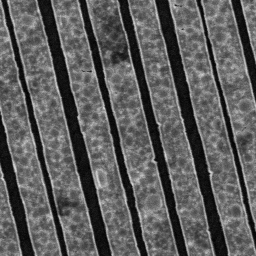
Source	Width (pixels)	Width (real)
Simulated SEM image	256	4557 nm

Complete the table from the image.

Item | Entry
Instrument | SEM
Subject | parallel lines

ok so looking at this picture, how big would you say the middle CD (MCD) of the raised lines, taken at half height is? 459 nanometers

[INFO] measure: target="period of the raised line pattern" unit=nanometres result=670